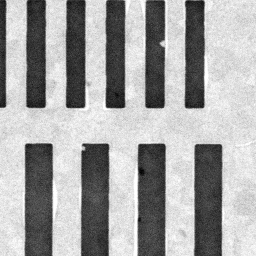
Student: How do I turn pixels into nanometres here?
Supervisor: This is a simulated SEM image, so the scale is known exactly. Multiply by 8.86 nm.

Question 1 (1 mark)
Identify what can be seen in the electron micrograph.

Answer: groups of lines, slits or small figures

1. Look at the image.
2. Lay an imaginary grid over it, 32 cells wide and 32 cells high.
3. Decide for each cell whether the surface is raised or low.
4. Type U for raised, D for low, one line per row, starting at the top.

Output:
DUUDDDUUDDDUUDDDUUDDDUUDDDUUUUUU
DUUDDDUUDDDUUDDDUUDDDUUDDDUUUUUU
DUUDDDUUDDDUUDDDUUDDDUUDDDUUUUUU
DUUDDDUUDDDUUDDDUUDDDUUDDDUUUUUU
DUUDDDUUDDDUUDDDUUDDDUUDDDUUUUUU
DUUDDDUUDDDUUDDDUUDDDUUDDDUUUUUU
DUUDDDUUDDDUUDDDUUDDDUUDDDUUUUUU
DUUDDDUUDDDUUDDDUUDDDUUDDDUUUUUU
DUUDDDUUDDDUUDDDUUDDDUUDDDUUUUUU
DUUDDDUUDDDUUDDDUUDDDUUDDDUUUUUU
DUUDDDUUDDDUUDDDUUDDDUUDDDUUUUUU
DUUDDDUUDDDUUDDDUUDDDUUDDDUUUUUU
DUUDDDUUDDDUUDDDUUDDDUUDDDUUUUUU
UUUUDUUUUDDUUDDUUUDDUUUDDUUUUUUU
UUUUUUUUUUUUUUUUUUUUUUUUUUUUUUUU
UUUUUUUUUUUUUUUUUUUUUUUUUUUUUUUU
UUUUUUUUUUUUUUUUUUUUUUUUUUUUUUUU
UUUUUUUUUUUUUUUUUUUUUUUUUUUUUUUU
UUUDDDDUUUDDDDUUUDDDDUUUDDDDUUUU
UUUDDDDUUUDDDDUUUDDDDUUUDDDDUUUU
UUUDDDDUUUDDDDUUUDDDDUUUDDDDUUUU
UUUDDDDUUUDDDDUUUDDDDUUUDDDDUUUU
UUUDDDDUUUDDDDUUUDDDDUUUDDDDUUUU
UUUDDDDUUUDDDDUUUDDDDUUUDDDDUUUU
UUUDDDDUUUDDDDUUUDDDDUUUDDDDUUUU
UUUDDDDUUUDDDDUUUDDDDUUUDDDDUUUU
UUUDDDDUUUDDDDUUUDDDDUUUDDDDUUUU
UUUDDDDUUUDDDDUUUDDDDUUUDDDDUUUU
UUUDDDDUUUDDDDUUUDDDDUUUDDDDUUUU
UUUDDDDUUUDDDDUUUDDDDUUUDDDDUUUU
UUUDDDDUUUDDDDUUUDDDDUUUDDDDUUUU
UUUDDDDUUUDDDDUUUDDDDUUUDDDDUUUU